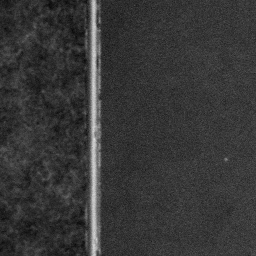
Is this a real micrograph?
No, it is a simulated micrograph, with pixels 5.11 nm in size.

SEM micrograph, one or a few lines or trenches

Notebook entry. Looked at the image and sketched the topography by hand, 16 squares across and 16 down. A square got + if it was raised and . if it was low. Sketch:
......++++++++++
......++++++++++
......++++++++++
......++++++++++
......++++++++++
......++++++++++
......++++++++++
......++++++++++
......++++++++++
......++++++++++
......++++++++++
......++++++++++
......++++++++++
......++++++++++
......++++++++++
......++++++++++